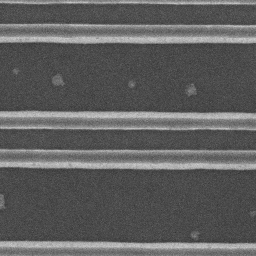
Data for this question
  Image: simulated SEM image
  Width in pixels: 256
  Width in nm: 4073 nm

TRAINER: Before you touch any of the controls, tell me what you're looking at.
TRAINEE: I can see lines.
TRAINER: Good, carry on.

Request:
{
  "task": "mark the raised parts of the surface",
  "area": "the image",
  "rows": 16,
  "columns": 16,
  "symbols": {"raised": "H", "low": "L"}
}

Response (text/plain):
HHHHHHHHHHHHHHHH
HHHHHHHHHHHHHHHH
LLLLLLLLLLLLLLLL
LLLLLLLLLLLLLLLL
LLLLLLLLLLLLLLLL
LLLLLLLLLLLLLLLL
LLLLLLLLLLLLLLLL
HHHHHHHHHHHHHHHH
HHHHHHHHHHHHHHHH
HHHHHHHHHHHHHHHH
LLLLLLLLLLLLLLLL
LLLLLLLLLLLLLLLL
LLLLLLLLLLLLLLLL
LLLLLLLLLLLLLLLL
LLLLLLLLLLLLLLLL
HHHHHHHHHHHHHHHH